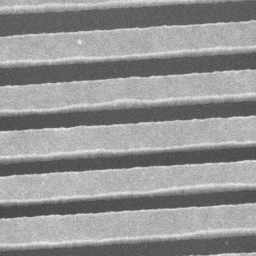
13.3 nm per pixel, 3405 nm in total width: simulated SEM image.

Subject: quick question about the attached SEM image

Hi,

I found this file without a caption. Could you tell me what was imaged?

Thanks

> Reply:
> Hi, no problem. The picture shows lines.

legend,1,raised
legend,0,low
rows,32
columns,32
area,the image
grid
11111111111111110000000000000000
00000000000000000000000000000000
00000000000000000000000000000000
00000000000000000111111111111111
01111111111111111111111111111111
11111111111111111111111111111111
11111111111111111111111111100000
11111111111100000000000000000000
00000000000000000000000000000000
00000000000000000000011111111111
00000011111111111111111111111111
11111111111111111111111111111111
11111111111111111111111111000000
11111111111100000000000000000000
00000000000000000000000000000000
00000000000000011111111111111111
11111111111111111111111111111111
11111111111111111111111111111111
11111111111111111111111110000000
11111111000000000000000000000000
00000000000000000000000001111111
00000000001111111111111111111111
11111111111111111111111111111111
11111111111111111111111111110000
11111111111111100000000000000000
10000000000000000000000000000001
00000000000000011111111111111111
11111111111111111111111111111111
11111111111111111111111111111111
11111111111111111111111110000000
11111111110000000000000000000000
00000000000000000000000000000000